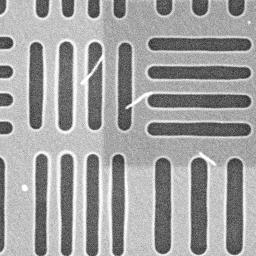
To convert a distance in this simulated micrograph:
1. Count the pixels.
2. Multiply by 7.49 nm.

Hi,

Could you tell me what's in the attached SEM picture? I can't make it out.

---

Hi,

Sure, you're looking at groups of lines, slits or small figures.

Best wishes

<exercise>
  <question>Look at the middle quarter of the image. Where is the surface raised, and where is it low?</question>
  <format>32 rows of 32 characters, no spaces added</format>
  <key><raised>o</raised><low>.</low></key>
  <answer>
...oo.....ooo....ooooo..........
...oo.....ooo....oooo...........
...oo.....ooo....oooo...........
...ooo....ooo....oooo...........
...ooo....ooo....ooooooooooooooo
...ooo....ooo....ooooooooooooooo
...ooo....ooo....ooooooooooooooo
...ooo....ooo....ooooo..........
...ooo....ooo....oooo...........
...ooo....ooo....oooo...........
...ooo....ooo...ooooo...........
...ooo....ooo....ooooooooooooooo
...ooo....ooo....ooooooooooooooo
...ooo....ooo....ooooooooooooooo
...ooo....ooo....ooooo.......ooo
..oooo...ooooo...oooo...........
.oooooo.oooooo..ooooo...........
ooooooooooooooooooooo...........
oooooooooooooooooooooooooooooooo
oooooooooooooooooooooooooooooooo
oooooooooooooooooooooooooooooooo
oooooooooooooooooooooooooooooooo
..oooo..ooooo.oooooooooooooooooo
...ooo...ooo...ooooooooo..oooooo
...oo....ooo...oooooooo....ooooo
...oo....ooo...oooooooo....oooo.
...oo....ooo...oooooooo....oooo.
...oo....ooo...oooooooo....oooo.
...oo....ooo...oooooooo....oooo.
...oo....ooo...oooooooo....oooo.
...oo....oo....oooooooo....oooo.
...oo....oo.....ooooooo....oooo.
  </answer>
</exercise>